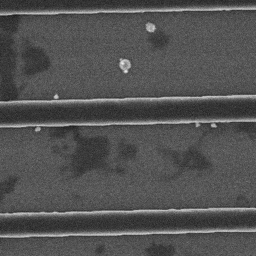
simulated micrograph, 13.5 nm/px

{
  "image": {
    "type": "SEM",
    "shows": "lines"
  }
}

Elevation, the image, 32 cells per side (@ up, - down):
@@@@@@@@@@@@@@@@@@@@@@@@@@@@@@@@
@@@@@@@@@@@@--------------------
--------------------------------
--------------------------------
--------------------------------
--------------------------------
--------------------------------
--------------------------------
--------------------------------
--------------------------------
--------------------------------
--------------------------------
------------@@@@@@@@@@@@@@@@@@@@
@@@@@@@@@@@@@@@@@@@@@@@@@@@@@@@@
@@@@@@@@@@@@@@@@@@@@@@@@@@@@@@@@
@@@@@@@@@@@@@@------------------
--------------------------------
--------------------------------
--------------------------------
--------------------------------
--------------------------------
--------------------------------
--------------------------------
--------------------------------
--------------------------------
--------------------------------
------------@@@@@@@@@@@@@@@@@@@@
@@@@@@@@@@@@@@@@@@@@@@@@@@@@@@@@
@@@@@@@@@@@@@@@@@@@@@@@@@@@@@@@@
@@@-----------------------------
--------------------------------
--------------------------------